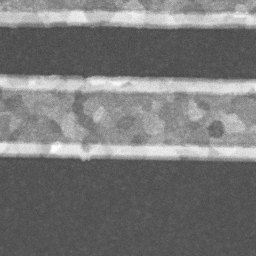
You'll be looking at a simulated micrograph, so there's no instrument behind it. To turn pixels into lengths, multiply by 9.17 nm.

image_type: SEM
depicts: one or a few lines or trenches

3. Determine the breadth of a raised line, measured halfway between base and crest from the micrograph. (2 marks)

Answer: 585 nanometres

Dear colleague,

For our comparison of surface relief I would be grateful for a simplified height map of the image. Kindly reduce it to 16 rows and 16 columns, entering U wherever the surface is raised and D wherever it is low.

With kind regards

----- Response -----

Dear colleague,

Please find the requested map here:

UUUUUUUUUUUUUUUU
DDDDDDDDDDDDDDDD
DDDDDDDDDDDDDDDD
DDDDDDDDDDDDDDDD
DDDDDDDDDDDDDDDD
UUUUUUUUUUUUUDDD
UUUUUUUUUUUUUUUU
UUUUUUUUUUUUUUUU
UUUUUUUUUUUUUUUU
DDDDDDDDDDDDDDDD
DDDDDDDDDDDDDDDD
DDDDDDDDDDDDDDDD
DDDDDDDDDDDDDDDD
DDDDDDDDDDDDDDDD
DDDDDDDDDDDDDDDD
DDDDDDDDDDDDDDDD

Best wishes